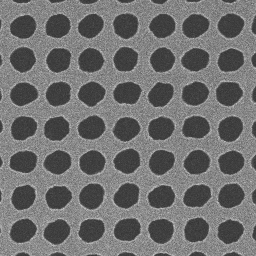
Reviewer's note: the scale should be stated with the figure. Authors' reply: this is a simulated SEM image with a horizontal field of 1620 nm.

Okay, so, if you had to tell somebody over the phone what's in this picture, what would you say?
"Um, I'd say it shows a regular array of holes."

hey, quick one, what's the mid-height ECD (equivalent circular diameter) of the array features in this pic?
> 157 nm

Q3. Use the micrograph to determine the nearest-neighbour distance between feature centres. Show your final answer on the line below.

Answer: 211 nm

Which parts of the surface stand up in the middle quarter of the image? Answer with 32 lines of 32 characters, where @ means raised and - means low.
-@@@------@@@-----@@@@-----@@@--
@@@@-----@@@@----@@@@@@---@@@@@-
@@@@@@@@@@@@@@@@@@@@@@@@@@@@@@@@
@@@@@@@@@@@@@@@@@@@@@@@@@@@@@@@@
@@@@@@--@@@@@@@--@@@@@@@@@@@@@@@
-@@@-----@@@@------@@@@----@@@--
--@@------@@@------@@@-----@@@--
-@@-------@@-------@@------@@---
--@@------@@@------@@------@@@--
-@@@@----@@@@-----@@@-----@@@@--
@@@@@@--@@@@@@@@@@@@@@---@@@@@@@
@@@@@@@@@@@@@@@@@@@@@@@@@@@@@@@@
@@@@@@@@@@@@@@@@@@@@@@@@@@@@@@@@
@@@@@@---@@@@@@-@@@@@@@@-@@@@@@@
-@@@------@@@-----@@@@-----@@@--
--@@------@@@------@@-------@@--
--@-------@@@------@@-------@---
-@@@-----@@@@-----@@@------@@@--
@@@@@---@@@@@@---@@@@@----@@@@@@
@@@@@@@@@@@@@@@@@@@@@@@@@@@@@@@@
@@@@@@@@@@@@@@@@@@@@@@@@@@@@@@@@
@@@@@@@@@@@@@@@---@@@@@@-@@@@@@@
-@@@@----@@@@@-----@@@-----@@@@-
--@@------@@@------@@@------@@@-
--@@------@@-------@@-------@@--
--@@------@@@------@@------@@@--
-@@@------@@@@----@@@@-----@@@--
@@@@@---@@@@@@@@@@@@@@@--@@@@@@@
@@@@@@@@@@@@@@@@@@@@@@@@@@@@@@@@
@@@@@@@@@@@@@@@@@@@@@@@@@@@@@@@@
@@@@@----@@@@@----@@@@@@---@@@@@
-@@@------@@@@-----@@@-----@@@@-